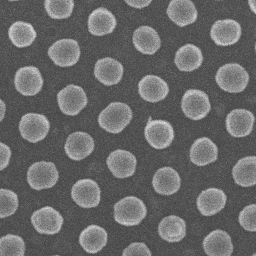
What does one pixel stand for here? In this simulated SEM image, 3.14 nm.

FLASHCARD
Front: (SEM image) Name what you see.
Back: a regular array of raised bodies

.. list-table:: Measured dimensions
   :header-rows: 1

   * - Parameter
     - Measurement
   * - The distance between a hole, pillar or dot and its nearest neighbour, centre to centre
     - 0.145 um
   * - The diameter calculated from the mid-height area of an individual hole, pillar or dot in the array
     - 87.7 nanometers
